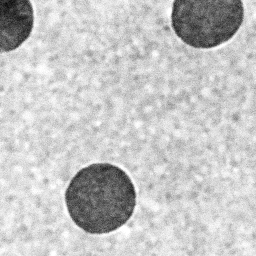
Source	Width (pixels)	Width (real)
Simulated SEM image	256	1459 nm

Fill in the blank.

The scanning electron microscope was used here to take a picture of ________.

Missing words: holes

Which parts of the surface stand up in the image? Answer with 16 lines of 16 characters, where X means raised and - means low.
--XXXXXXXXX----X
--XXXXXXXXX----X
--XXXXXXXXX---XX
XXXXXXXXXXXXXXXX
XXXXXXXXXXXXXXXX
XXXXXXXXXXXXXXXX
XXXXXXXXXXXXXXXX
XXXXXXXXXXXXXXXX
XXXXXXXXXXXXXXXX
XXXXXXXXXXXXXXXX
XXXXX---XXXXXXXX
XXXX----XXXXXXXX
XXXX-----XXXXXXX
XXXX----XXXXXXXX
XXXXX--XXXXXXXXX
XXXXXXXXXXXXXXXX